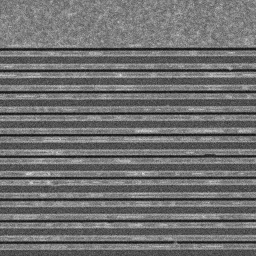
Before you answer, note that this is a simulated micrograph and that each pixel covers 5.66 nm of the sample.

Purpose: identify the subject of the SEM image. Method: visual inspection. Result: parallel lines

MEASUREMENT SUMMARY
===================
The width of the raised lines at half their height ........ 32.5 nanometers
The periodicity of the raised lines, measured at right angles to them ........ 60.8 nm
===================